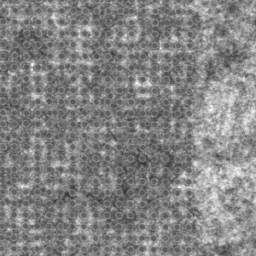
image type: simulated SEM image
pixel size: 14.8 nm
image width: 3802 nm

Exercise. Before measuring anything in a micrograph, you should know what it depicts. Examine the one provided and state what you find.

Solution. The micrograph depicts a regular array of raised bodies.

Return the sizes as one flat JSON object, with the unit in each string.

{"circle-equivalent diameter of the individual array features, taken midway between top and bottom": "103 nm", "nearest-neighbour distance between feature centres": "0.165 um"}